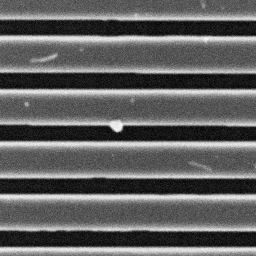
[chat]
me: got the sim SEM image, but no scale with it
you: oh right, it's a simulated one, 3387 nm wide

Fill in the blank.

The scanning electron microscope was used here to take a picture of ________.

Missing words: lines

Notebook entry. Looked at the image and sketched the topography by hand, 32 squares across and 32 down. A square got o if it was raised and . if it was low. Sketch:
oooooooooooooooooooooooooooooooo
oooooooooooooooooooooooooooooooo
................................
................................
................................
oooooooooooooooooooooooooooooooo
oooooooooooooooooooooooooooooooo
oooooooooooooooooooooooooooooooo
oooooooooooooooooooooooooooooooo
................................
................................
oooooooooooooooooooooooooooooooo
oooooooooooooooooooooooooooooooo
oooooooooooooooooooooooooooooooo
oooooooooooooooooooooooooooooooo
.....ooooooooooooooooooooooooooo
................................
................................
oooooooooooooooooooooooooooooooo
oooooooooooooooooooooooooooooooo
oooooooooooooooooooooooooooooooo
oooooooooooooooooooooooooooooooo
................................
................................
oooooooooooooooooooooooooooooooo
oooooooooooooooooooooooooooooooo
oooooooooooooooooooooooooooooooo
oooooooooooooooooooooooooooooooo
oooooooooooooooooooooooooooooooo
................................
................................
oooooooooooooooooooooooooooooooo